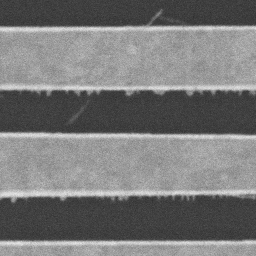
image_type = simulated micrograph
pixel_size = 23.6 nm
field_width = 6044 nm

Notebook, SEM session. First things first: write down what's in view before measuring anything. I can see lines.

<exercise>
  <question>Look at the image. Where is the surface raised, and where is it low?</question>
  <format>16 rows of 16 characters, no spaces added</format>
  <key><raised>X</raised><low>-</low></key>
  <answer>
----------------
----------------
XXXXXXXXXXXXXXXX
XXXXXXXXXXXXXXXX
XXXXXXXXXXXXXXXX
XXXXXXXXXXXXXXXX
----------------
----------------
XXXXXXXXXXXXXXXX
XXXXXXXXXXXXXXXX
XXXXXXXXXXXXXXXX
XXXXXXXXXXXXXXXX
----------------
----------------
----------------
XXXXXXXXXXXXXXXX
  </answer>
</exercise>